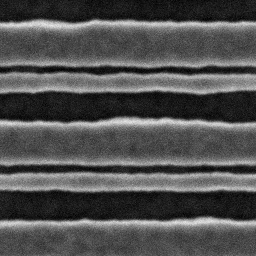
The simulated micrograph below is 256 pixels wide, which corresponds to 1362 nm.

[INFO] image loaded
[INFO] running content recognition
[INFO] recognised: lines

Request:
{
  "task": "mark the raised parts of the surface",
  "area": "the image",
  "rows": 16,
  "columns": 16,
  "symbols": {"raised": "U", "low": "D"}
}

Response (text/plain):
DDDDDDDDDDDDDDDD
UUUUUUUUUUUUUUUU
UUUUUUUUUUUUUUUU
UUUUUUUUUUUUUUUU
UUUUUUUUUUUUUUUU
UUUUUUUUUUUUUUUU
DDDDDDDDDDDDDDDD
DDDDDDDDDDDDDDDD
UUUUUUUUUUUUUUUU
UUUUUUUUUUUUUUUU
UUUUUUUUUUUUUUUU
UUUUUUUUUUUUUUUU
DDDDDDDDDDDDDDDD
DDDDDDDDDDDDDDDD
UUUUUUUUUUUUUUUU
UUUUUUUUUUUUUUUU